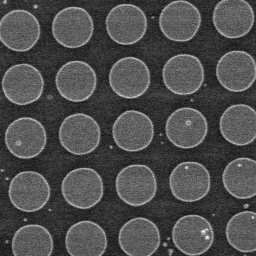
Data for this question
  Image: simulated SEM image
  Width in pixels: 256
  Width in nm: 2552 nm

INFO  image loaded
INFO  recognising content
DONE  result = an array of small figures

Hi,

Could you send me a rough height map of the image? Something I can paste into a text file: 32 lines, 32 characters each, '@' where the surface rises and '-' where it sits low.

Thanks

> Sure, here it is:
---------------------@@@---@@@@-
-@@-----@@@---@@@@--@@@@@--@@@@@
@@@@@--@@@@--@@@@@--@@@@@--@@@@@
@@@@@--@@@@@-@@@@@--@@@@@--@@@@-
@@@@@--@@@@---@@@@---@@@----@@--
-@@@----@@@----@----------------
-----------------------------@--
---------------@@----@@@@---@@@@
-@@@----@@@---@@@@--@@@@@--@@@@@
-@@@@--@@@@@--@@@@@-@@@@@--@@@@@
@@@@@--@@@@@--@@@@@--@@@@---@@@-
-@@@@--@@@@@--@@@@----@@--------
-@@@-----@----------------------
-----------------------------@@-
---------@@----@@@---@@@@---@@@@
-@@@@---@@@@--@@@@@--@@@@@--@@@@
-@@@@@-@@@@@--@@@@@--@@@@@--@@@@
-@@@@@-@@@@@--@@@@@--@@@@---@@@@
-@@@@---@@@@---@@@--------------
--@@----------------------------
-----------------------@@----@@@
---@-----@@@---@@@@---@@@@--@@@@
--@@@@--@@@@@--@@@@--@@@@@--@@@@
-@@@@@--@@@@@--@@@@--@@@@@--@@@@
-@@@@@--@@@@@--@@@@---@@@----@@@
--@@@@---@@@----@@--------------
------------------------------@-
----------------@@----@@@@---@@@
---@@----@@@@--@@@@@--@@@@--@@@@
--@@@@--@@@@@--@@@@@--@@@@@-@@@@
--@@@@@-@@@@@--@@@@@--@@@@---@@@
--@@@@---@@@@---@@@----@@-------